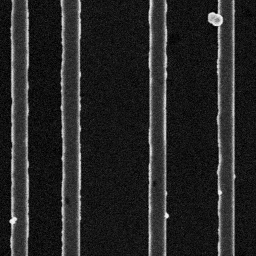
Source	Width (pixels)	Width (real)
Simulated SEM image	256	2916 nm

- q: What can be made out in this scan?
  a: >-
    lines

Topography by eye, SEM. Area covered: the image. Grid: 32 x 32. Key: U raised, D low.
DUUDDDDDUUDDDDDDDDDUUDDDDDDUUDDD
DUUUDDDDUUDDDDDDDDDUUDDDDDDUUDDD
DUUUDDDDUUDDDDDDDDDUUDDDDDUUUDDD
DUUUDDDDUUDDDDDDDDDUUDDDDDDUUDDD
DUUUDDDDUUDDDDDDDDDUUDDDDDDUUDDD
DUUUDDDDUUDDDDDDDDDUUDDDDDDUUDDD
DUUUDDDDUUDDDDDDDDDUUDDDDDDUUDDD
DUUUDDDDUUDDDDDDDDDUUDDDDDDUUDDD
DUUUDDDDUUDDDDDDDDDUUDDDDDDUUDDD
DUUDDDDDUUDDDDDDDDDUUDDDDDDUUDDD
DUUUDDDDUUDDDDDDDDDUUDDDDDDUUDDD
DUUDDDDDUUDDDDDDDDDUUDDDDDDUUDDD
DUUDDDDDUUDDDDDDDDDUUDDDDDDUUDDD
DUUUDDDDUUDDDDDDDDDUUDDDDDDUUDDD
DUUDDDDDUUDDDDDDDDDUUDDDDDDUUDDD
DUUDDDDDUUDDDDDDDDDUUDDDDDDUUDDD
DUUDDDDDUUDDDDDDDDDUUDDDDDDUUDDD
DUUDDDDDUUDDDDDDDDDUUDDDDDDUUDDD
DUUDDDDDUUDDDDDDDDDUUDDDDDDUUDDD
DUUDDDDDUUDDDDDDDDDUUDDDDDDUUDDD
DUUUDDDDUUDDDDDDDDDUUDDDDDDUUDDD
DUUUDDDDUUDDDDDDDDDUUDDDDDDUUDDD
DUUUDDDDUUDDDDDDDDDUUDDDDDDUUDDD
DUUUDDDDUUDDDDDDDDDUUDDDDDDUUDDD
DUUUDDDDUUDDDDDDDDDUUDDDDDDUUDDD
DUUUDDDDUUDDDDDDDDDUUDDDDDDUUDDD
DUUUDDDDUUDDDDDDDDDUUDDDDDDUUDDD
DUUUDDDDUUDDDDDDDDDUUDDDDDDUUDDD
DUUUDDDDUUDDDDDDDDDUUDDDDDDUUDDD
DUUUDDDDUUDDDDDDDDDUUDDDDDDUUDDD
DUUDDDDDUUDDDDDDDDDUUDDDDDDUUDDD
DUUDDDDDUUDDDDDDDDDUUDDDDDDUUDDD